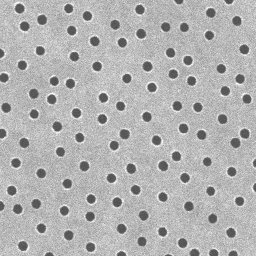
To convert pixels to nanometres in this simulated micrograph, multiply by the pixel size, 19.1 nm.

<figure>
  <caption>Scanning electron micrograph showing a regular array of holes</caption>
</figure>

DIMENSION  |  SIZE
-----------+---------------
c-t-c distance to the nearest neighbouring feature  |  417 nanometres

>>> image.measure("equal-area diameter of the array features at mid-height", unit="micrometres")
0.189